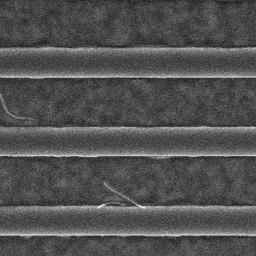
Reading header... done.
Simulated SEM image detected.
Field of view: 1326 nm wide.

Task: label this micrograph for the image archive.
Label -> lines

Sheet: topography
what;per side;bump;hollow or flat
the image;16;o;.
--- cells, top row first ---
................
................
................
oooooooooooooooo
oooooooooooooooo
................
................
................
oooooooooooooooo
oooooooooooooooo
................
................
................
oooooooooooooooo
oooooooooooooooo
................